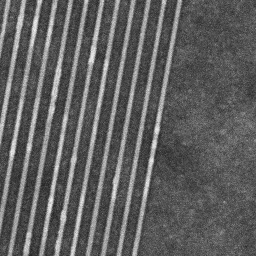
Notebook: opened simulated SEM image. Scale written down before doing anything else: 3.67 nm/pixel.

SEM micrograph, parallel lines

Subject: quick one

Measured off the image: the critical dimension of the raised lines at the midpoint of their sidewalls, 10.4 nm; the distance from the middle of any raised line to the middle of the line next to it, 56.3 nanometers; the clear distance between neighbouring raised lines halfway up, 44.3 nm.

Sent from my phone